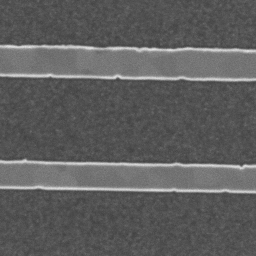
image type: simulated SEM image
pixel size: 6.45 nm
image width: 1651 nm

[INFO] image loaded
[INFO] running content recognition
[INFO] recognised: one or a few lines or trenches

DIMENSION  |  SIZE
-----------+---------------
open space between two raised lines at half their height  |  556 nanometers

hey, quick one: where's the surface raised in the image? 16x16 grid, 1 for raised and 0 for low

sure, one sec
0000000000000000
0000000000000000
0000000000000000
1111111111111111
1111111111111111
0000000000000000
0000000000000000
0000000000000000
0000000000000000
0000000000000000
1111111111111111
1111111111111111
0000000000000000
0000000000000000
0000000000000000
0000000000000000